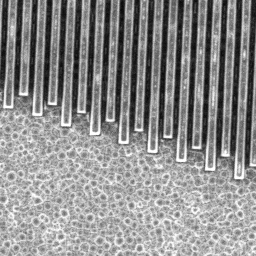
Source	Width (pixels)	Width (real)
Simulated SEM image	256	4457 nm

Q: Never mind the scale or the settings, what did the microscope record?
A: parallel lines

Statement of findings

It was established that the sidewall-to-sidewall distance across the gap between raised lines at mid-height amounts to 120 nanometres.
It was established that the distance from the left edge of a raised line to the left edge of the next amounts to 254 nm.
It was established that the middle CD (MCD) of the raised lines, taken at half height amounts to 135 nm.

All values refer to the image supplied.